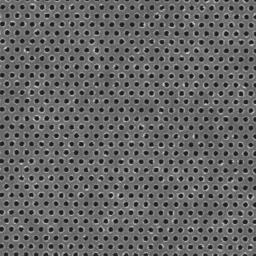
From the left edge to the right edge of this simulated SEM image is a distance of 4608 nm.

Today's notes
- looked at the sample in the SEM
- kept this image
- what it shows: a regular array of holes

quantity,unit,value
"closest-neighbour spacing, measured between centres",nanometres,172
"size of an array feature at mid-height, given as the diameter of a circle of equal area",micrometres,0.0885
